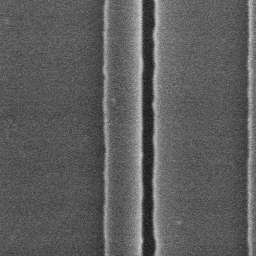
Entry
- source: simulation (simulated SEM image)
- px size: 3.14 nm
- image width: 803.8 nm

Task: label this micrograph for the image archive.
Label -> lines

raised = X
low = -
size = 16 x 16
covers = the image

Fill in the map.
-------XX-------
-------XX-------
-------XX-------
-------XX-------
-------XX-------
-------XX-------
-------XX-------
-------XX-------
-------XX-------
-------XX-------
-------XX-------
-------XX-------
-------XX-------
-------XX-------
-------XX-------
-------XX-------